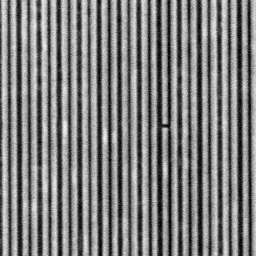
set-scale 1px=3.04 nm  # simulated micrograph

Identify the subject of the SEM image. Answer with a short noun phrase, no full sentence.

parallel lines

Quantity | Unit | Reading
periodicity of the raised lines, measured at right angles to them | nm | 30.4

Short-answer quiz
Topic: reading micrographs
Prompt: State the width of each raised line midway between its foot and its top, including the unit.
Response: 17.1 nm